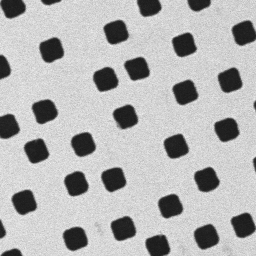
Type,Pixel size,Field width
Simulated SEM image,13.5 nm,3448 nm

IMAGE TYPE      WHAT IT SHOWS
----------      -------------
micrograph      a regular array of holes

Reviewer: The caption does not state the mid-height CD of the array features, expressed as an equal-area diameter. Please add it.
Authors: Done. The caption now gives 331 nanometres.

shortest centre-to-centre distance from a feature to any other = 606 nm